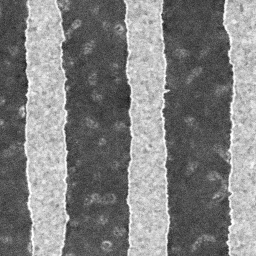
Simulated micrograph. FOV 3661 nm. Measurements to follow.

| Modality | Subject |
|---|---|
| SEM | one or a few lines or trenches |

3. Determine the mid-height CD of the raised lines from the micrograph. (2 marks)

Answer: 35.9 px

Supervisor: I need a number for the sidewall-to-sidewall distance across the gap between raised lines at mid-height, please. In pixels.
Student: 64.9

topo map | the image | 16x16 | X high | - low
--XX----XX----XX
--XX----XX----XX
--XX----XX----XX
--XX----XX----XX
--XX----XX-----X
--XX----XX-----X
--XX----XX-----X
--XX----XX-----X
--XX----XX-----X
--XX----XX----XX
--XX----XX----XX
--XX----XX----XX
--XX----XX----XX
--XX----XX----XX
--XX----XX----XX
--XX----XX----XX